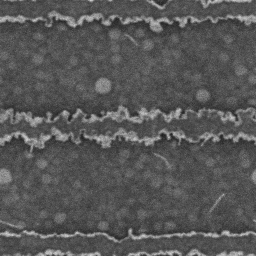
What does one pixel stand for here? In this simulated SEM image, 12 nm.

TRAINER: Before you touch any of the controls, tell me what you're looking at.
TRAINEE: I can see one or a few lines or trenches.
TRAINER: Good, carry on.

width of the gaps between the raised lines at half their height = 1140 nm